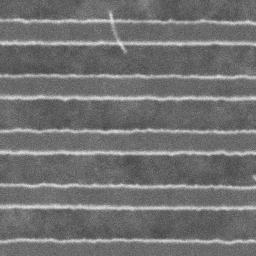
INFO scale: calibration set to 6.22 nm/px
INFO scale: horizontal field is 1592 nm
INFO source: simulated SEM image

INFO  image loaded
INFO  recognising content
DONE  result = lines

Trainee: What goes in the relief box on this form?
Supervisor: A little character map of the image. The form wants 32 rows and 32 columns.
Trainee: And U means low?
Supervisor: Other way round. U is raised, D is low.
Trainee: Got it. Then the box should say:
DDDDDDDDDDDDDDDDDDDDDDDDDDDDDDDD
DDDDDDDDDDDDDDDDDDDDDDDDDDDDDDDD
UDUDDDDDDDDDDUDDDDDDDDDDDDDDDDDD
UUUUUUUUUUUUUUUUUUUUUUUUUUUUUUUU
UUUUUUUUUUUUUUUUUUUUUUUUUUUUUUUU
DDDDDUUDUUUUDDUUDUUUUUUUUUUDUUUU
DDDDDDDDDDDDDDDDDDDDDDDDDDDDDDDD
DDDDDDDDDDDDDDDDDDDDDDDDDDDDDDDD
DDDDDDDDDDDDDDDDDDDDDDDDDDDDDDDD
UUUUUUUUUUUUUUUUUUUUUUUUUDDUDDUD
UUUUUUUUUUUUUUUUUUUUUUUUUUUUUUUU
UUUUUUUUUUUUUUUUUUUUUUUUUUUUUUUU
DDDDDDDDDDDDDDDDDDDDDDDDDDDDUDDD
DDDDDDDDDDDDDDDDDDDDDDDDDDDDDDDD
DDDDDDDDDDDDDDDDDDDDDDDDDDDDDDDD
DDDDDDDDDDDDDDDDDDDDDDDDDDDDDDDD
UUUUUUUUUUUUUUUUUUUUUUUUUUUUUUUU
UUUUUUUUUUUUUUUUUUUUUUUUUUUUUUUU
UUUUUUUUUUUUUUUUUUUUUUUUUUUUUUUU
DDDDDDDDDDDDDDDDDDDDDDDDDDDDDDDD
DDDDDDDDDDDDDDDDDDDDDDDDDDDDDDDD
DDDDDDDDDDDDDDDDDDDDDDDDDDDDDDDD
DDDDDDDDDDDDDDDDDDDDDDDDDDDDDDDD
UUUUUUUUUUUUUUUUUUUUUUUUUUUUUUUU
UUUUUUUUUUUUUUUUUUUUUUUUUUUUUUUU
UUUUUUUUUUUUUUUUUUUUUUUUUUUUUUUU
DDDDDDDDDDDDDDDDDDDDDDDDDDDDDDDD
DDDDDDDDDDDDDDDDDDDDDDDDDDDDDDDD
DDDDDDDDDDDDDDDDDDDDDDDDDDDDDDDD
DDDDDDDDDDDDDDDDDDDDDDDDDDDDDDDD
UUUUUUUUUUUUUUUUUUUUUUUUUUUUUUUU
UUUUUUUUUUUUUUUUUUUUUUUUUUUUUUUU